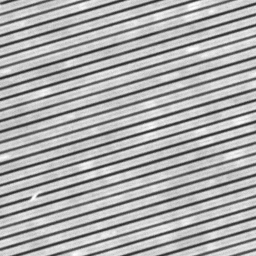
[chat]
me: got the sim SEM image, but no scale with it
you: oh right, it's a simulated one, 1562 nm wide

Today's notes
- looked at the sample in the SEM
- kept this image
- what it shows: parallel lines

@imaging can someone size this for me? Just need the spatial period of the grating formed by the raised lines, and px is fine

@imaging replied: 10.2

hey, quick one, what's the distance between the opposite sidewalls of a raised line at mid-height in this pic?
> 43.1 nm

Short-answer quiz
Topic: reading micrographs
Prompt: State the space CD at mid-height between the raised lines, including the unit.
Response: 18.2 nm